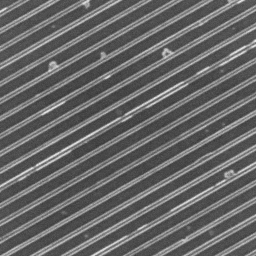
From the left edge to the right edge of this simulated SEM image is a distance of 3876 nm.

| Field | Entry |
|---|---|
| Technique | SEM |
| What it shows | parallel lines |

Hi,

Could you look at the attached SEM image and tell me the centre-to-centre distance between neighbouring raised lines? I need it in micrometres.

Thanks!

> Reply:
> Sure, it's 0.23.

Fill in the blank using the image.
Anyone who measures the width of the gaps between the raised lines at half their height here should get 170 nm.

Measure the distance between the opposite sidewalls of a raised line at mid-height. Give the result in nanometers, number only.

55.9